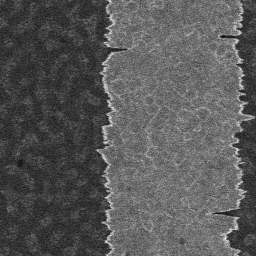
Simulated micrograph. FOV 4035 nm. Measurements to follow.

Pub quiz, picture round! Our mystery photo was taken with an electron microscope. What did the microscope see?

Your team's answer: one or a few lines or trenches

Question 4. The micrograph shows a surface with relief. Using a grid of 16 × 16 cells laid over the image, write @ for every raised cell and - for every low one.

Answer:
-------@@@@@@@@-
-------@@@@@@@@-
-------@@@@@@@@-
-------@@@@@@@@-
-------@@@@@@@@-
-------@@@@@@@@-
-------@@@@@@@@-
-------@@@@@@@@-
-------@@@@@@@@-
------@@@@@@@@@-
-------@@@@@@@@-
-------@@@@@@@@-
-------@@@@@@@@-
-------@@@@@@@--
-------@@@@@@@--
-------@@@@@@@@-